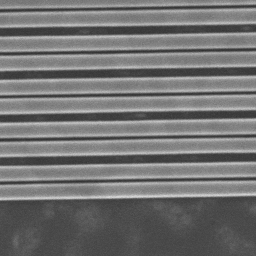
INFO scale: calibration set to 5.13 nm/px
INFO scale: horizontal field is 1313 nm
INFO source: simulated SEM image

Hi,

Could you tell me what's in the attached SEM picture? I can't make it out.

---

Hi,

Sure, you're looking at parallel lines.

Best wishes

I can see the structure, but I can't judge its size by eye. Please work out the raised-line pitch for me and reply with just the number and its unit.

0.11 micrometres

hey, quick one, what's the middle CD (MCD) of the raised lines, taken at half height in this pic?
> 71.8 nm